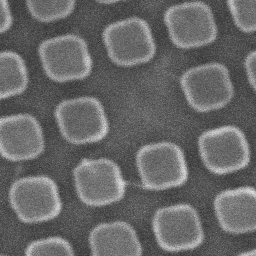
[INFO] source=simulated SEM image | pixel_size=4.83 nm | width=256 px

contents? a regular array of raised bodies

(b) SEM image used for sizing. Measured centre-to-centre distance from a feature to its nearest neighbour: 310 nanometres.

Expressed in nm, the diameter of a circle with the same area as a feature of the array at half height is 228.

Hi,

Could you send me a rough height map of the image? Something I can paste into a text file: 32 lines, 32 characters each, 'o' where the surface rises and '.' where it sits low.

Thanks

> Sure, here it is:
o...ooooo...............o....ooo
o...ooooo............ooooo...ooo
o....o..........o....oooooo..ooo
o.............oooo...oooooo...oo
.............oooooo..oooooo.....
.....ooooo...oooooo...ooo.......
.....oooooo...ooooo.............
ooo..oooooo...oooo.............o
ooo...ooooo..............ooo...o
ooo...ooooo............ooooo...o
ooo....................oooooo...
oo.....................oooooo...
..........oo............ooooo...
.......oooooo...........ooo.....
..oo...oooooo...................
ooooo..oooooo...................
ooooo...ooooo.............oooo..
ooooo....ooo.............oooooo.
ooooo.............oooo...oooooo.
.ooo.............oooooo..oooooo.
..........oooo...oooooo...ooooo.
.........oooooo...ooooo....o....
...ooo...oooooo...ooooo.........
..ooooo...ooooo....o............
.oooooo...ooooo............ooooo
..ooooo....oo..............ooooo
..ooooo.............oooo...ooooo
...oo..............oooooo..ooooo
............oooo...oooooo...oooo
...........oooooo...ooooo.......
....oooo...oooooo...ooooo.......
...oooooo...oooooo..............